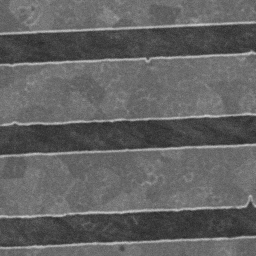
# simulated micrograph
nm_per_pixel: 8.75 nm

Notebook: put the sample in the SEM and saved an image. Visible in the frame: one or a few lines or trenches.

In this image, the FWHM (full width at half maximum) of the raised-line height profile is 537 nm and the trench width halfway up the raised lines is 30.7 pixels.